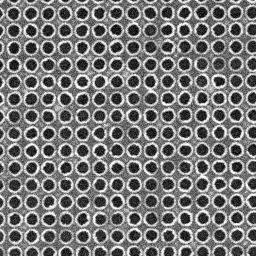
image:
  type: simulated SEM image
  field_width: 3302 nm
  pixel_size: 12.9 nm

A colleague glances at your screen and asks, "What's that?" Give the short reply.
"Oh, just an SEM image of a regular array of holes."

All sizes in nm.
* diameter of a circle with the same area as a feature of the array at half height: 159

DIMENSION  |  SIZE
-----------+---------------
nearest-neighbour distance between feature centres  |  16.7 px